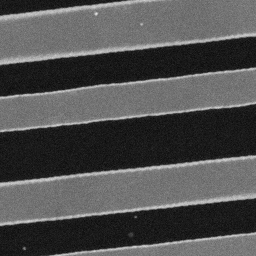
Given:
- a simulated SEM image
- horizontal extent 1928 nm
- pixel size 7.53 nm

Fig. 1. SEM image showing lines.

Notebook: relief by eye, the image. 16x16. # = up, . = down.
....############
################
##############..
#####...........
.............###
.....###########
################
#######.........
................
................
.........#######
################
###############.
#####...........
................
.......#########